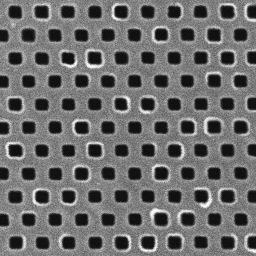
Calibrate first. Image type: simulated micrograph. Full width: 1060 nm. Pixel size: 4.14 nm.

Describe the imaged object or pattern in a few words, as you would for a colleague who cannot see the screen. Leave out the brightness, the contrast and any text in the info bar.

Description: a regular array of holes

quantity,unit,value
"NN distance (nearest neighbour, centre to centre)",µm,0.108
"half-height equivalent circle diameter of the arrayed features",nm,54.9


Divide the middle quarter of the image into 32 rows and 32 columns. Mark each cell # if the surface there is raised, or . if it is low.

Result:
################################
################################
################################
###...###...####...####...###...
###...###....###...####...###...
###...####..####...####...####..
################################
################################
################################
..####...####...###....###...###
...###....###...###....###...###
..#####..#####..####..#####..###
################################
################################
###..#####..#####..####..####...
###...###....###...####...###...
###...###....###...####...###...
################################
################################
################################
..####...####...####..####...###
...###....###...###....###...###
...###...####...####...###...###
################################
################################
################################
###...####..####...####...###...
###...####...###...####...###...
###...####..####...####...####..
################################
################################
################################